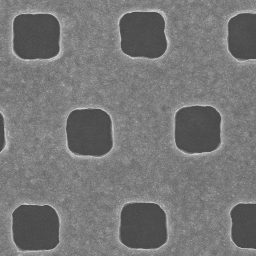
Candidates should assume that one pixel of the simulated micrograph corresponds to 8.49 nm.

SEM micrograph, holes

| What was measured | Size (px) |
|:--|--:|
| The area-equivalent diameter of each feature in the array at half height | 50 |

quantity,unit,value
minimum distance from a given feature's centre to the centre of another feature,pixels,107